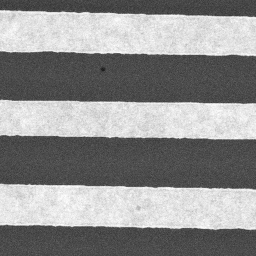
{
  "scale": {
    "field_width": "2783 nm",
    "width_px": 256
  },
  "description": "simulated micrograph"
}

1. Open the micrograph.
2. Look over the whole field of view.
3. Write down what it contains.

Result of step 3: lines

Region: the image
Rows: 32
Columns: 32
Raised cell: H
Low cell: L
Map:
LLLLLLLLLLLLLLLLLLLLLLLLLLLLLLLL
HHHHHHLHLLLLLLLLLLLLLLLLLLLLLLLL
HHHHHHHHHHHHHHHHHHHHHHHHHHHHHHHH
HHHHHHHHHHHHHHHHHHHHHHHHHHHHHHHH
HHHHHHHHHHHHHHHHHHHHHHHHHHHHHHHH
HHHHHHHHHHHHHHHHHHHHHHHHHHHHHHHH
LLLLLLLLLHHHHHHHHHHHHHHHHHHHHHHH
LLLLLLLLLLLLLLLLLLLLLLLLLLLLLLLL
LLLLLLLLLLLLLLLLLLLLLLLLLLLLLLLL
LLLLLLLLLLLLLLLLLLLLLLLLLLLLLLLL
LLLLLLLLLLLLLLLLLLLLLLLLLLLLLLLL
LLLLLLLLLLLLLLLLLLLLLLLLLLLLLLLL
LLLLLLLLLLLLLLLLLLLLLLLLLLLLLLLL
HHHHHHHHHHHHHHHHHHHHHHHHHHHHHHHH
HHHHHHHHHHHHHHHHHHHHHHHHHHHHHHHH
HHHHHHHHHHHHHHHHHHHHHHHHHHHHHHHH
HHHHHHHHHHHHHHHHHHHHHHHHHHHHHHHH
LLLLLLLLLLLLLLLLLLLLLLLLLLLLLLLL
LLLLLLLLLLLLLLLLLLLLLLLLLLLLLLLL
LLLLLLLLLLLLLLLLLLLLLLLLLLLLLLLL
LLLLLLLLLLLLLLLLLLLLLLLLLLLLLLLL
LLLLLLLLLLLLLLLLLLLLLLLLLLLLLLLL
LLLLLLLLLLLLLLLLLLLLLLLLLLLLLLLL
HHHHHHHHHHHHHHHHHHHHHHLLLLLLLLLL
HHHHHHHHHHHHHHHHHHHHHHHHHHHHHHHH
HHHHHHHHHHHHHHHHHHHHHHHHHHHHHHHH
HHHHHHHHHHHHHHHHHHHHHHHHHHHHHHHH
HHHHHHHHHHHHHHHHHHHHHHHHHHHHHHHH
LLLLLLLLLLLLLLLLLLLLLHLLLHHHHHHH
LLLLLLLLLLLLLLLLLLLLLLLLLLLLLLLL
LLLLLLLLLLLLLLLLLLLLLLLLLLLLLLLL
LLLLLLLLLLLLLLLLLLLLLLLLLLLLLLLL